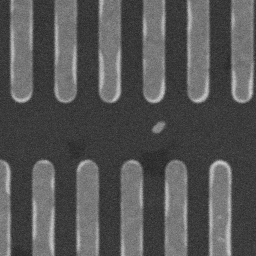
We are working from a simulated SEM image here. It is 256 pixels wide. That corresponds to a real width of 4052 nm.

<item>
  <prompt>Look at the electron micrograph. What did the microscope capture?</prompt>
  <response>groups of lines, slits or small figures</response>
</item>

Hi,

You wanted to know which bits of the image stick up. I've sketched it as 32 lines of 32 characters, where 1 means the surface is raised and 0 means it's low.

01110001100001100011000011000111
01110001100001100011000011000111
01110001100011100011000011000111
01110001100011100011000011000111
01110001100011100011000011000111
00110001100011100011000011000111
00110001100011100011000011000111
01110001100001100011000011000111
01110001100001100011000011000110
00110001100001100011000011000110
01110001100001100011000011000110
01110001100011100011000011000110
00100000100001000001000010000010
00000000000000000000000000000000
00000000000000000000000000000000
00000000000000000000000000000000
00000000000000000000000000000000
00000000000000000000000000000000
00000000000000000000000000000000
00000000000000000000000000000000
10000100001100001000011000010000
10001110001100011100011000111000
10001110001100011100011000111000
10001110001100011100011000111000
10001110001100011100011000111000
10001110001100011100011000111000
10001110001100011100011000111000
10001110001100011100011000111000
10001100001100011100011000111000
10001100001100011100011000110000
10001100001100011100011000111000
10001110001100011100011000111000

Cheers